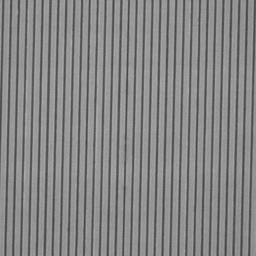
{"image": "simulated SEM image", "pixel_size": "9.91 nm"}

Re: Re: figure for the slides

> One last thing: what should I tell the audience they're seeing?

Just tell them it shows parallel lines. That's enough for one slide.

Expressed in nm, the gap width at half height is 26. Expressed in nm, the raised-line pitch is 77.9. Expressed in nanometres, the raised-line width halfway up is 53.2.